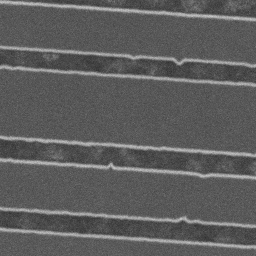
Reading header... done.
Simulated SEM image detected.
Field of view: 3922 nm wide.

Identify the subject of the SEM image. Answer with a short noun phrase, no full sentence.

one or a few lines or trenches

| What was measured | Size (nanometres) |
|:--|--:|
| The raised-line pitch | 1220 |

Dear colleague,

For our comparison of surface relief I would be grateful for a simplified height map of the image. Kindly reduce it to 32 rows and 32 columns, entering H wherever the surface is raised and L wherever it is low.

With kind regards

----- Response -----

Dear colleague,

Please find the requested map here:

HHHHHLLLLLLLLLLLLLLLLLLLLLLLLLLL
HHHHHHHHHHHHHHHHHHLLLLLLLLLLLLLL
HHHHHHHHHHHHHHHHHHHHHHHHHHHHHHHH
HHHHHHHHHHHHHHHHHHHHHHHHHHHHHHHH
HHHHHHHHHHHHHHHHHHHHHHHHHHHHHHHH
HHHHHHHHHHHHHHHHHHHHHHHHHHHHHHHH
LLLLLLLLLHHHHHHHHHHHHHHHHHHHHHHH
LLLLLLLLLLLLLLLLLLLLLLHHHHHHHHHH
HHLLLLLLLLLLLLLLLLLLLLLLLLLLLLLL
HHHHHHHHHHHHHHHHLLLLLLLLLLLLLLLL
HHHHHHHHHHHHHHHHHHHHHHHHHHHHHHHL
HHHHHHHHHHHHHHHHHHHHHHHHHHHHHHHH
HHHHHHHHHHHHHHHHHHHHHHHHHHHHHHHH
HHHHHHHHHHHHHHHHHHHHHHHHHHHHHHHH
HHHHHHHHHHHHHHHHHHHHHHHHHHHHHHHH
HHHHHHHHHHHHHHHHHHHHHHHHHHHHHHHH
HHHHHHHHHHHHHHHHHHHHHHHHHHHHHHHH
LLLLLHHHHHHHHHHHHHHHHHHHHHHHHHHH
LLLLLLLLLLLLLLLLLLHHHHHHHHHHHHHH
LLLLLLLLLLLLLLLLLLLLLLLLLLLLLLLL
HHHHHHHLLLLLLLLLLLLLLLLLLLLLLLLL
HHHHHHHHHHHHHHHHHHHHHHLLLLLLLLLL
HHHHHHHHHHHHHHHHHHHHHHHHHHHHHHHH
HHHHHHHHHHHHHHHHHHHHHHHHHHHHHHHH
HHHHHHHHHHHHHHHHHHHHHHHHHHHHHHHH
HHHHHHHHHHHHHHHHHHHHHHHHHHHHHHHH
LLLLLLHHHHHHHHHHHHHHHHHHHHHHHHHH
LLLLLLLLLLLLLLLLLLLLLHLHHHHHHHHH
LLLLLLLLLLLLLLLLLLLLLLLLLLLLLLLL
HHHHHHHHHHHHLLLLLLLLLLLLLLLLLLLL
HHHHHHHHHHHHHHHHHHHHHHHHHHLLLLLL
HHHHHHHHHHHHHHHHHHHHHHHHHHHHHHHH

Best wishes